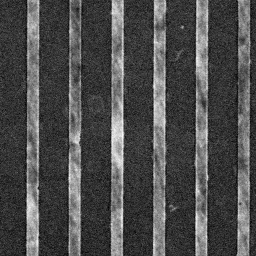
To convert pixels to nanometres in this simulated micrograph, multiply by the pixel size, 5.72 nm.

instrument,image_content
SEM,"parallel lines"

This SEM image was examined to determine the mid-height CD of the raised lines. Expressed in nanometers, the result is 64.3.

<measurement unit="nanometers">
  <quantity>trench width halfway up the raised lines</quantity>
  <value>179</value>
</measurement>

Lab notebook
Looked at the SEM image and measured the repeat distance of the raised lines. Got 241 nm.